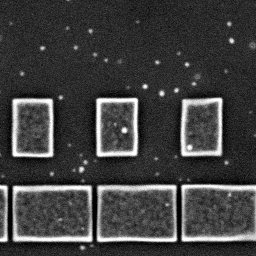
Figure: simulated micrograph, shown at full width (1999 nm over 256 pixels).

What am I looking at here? wiring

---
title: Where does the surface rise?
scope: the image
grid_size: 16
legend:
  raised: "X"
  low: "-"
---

----------------
----------------
----------------
----------------
----------------
----------------
-XX---XX----XX--
-XX---XX---XXX--
-XX---XX---XXX--
-XX---XX----X---
----------------
----------------
XXXXXXXXXXXXXXXX
XXXXXXXXXXXXXXXX
-XXXXXXXXXXXXXXX
----------------